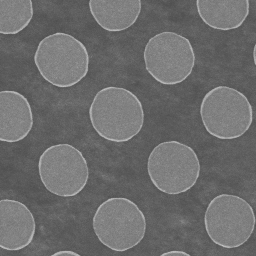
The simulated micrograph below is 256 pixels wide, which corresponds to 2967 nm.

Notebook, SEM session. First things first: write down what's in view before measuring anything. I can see a regular array of raised bodies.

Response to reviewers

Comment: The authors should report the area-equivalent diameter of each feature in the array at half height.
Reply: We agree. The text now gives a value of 0.593 um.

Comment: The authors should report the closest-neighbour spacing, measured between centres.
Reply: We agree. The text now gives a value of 894 nm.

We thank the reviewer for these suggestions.